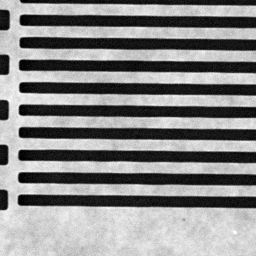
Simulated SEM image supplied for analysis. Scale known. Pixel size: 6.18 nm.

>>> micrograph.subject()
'groups of lines, slits or small figures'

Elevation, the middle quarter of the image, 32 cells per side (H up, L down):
LLLLLLLLLLLLLLLLLLLLLLLLLLLLLLLL
LLLLLLLLLLLLLLLLLLLLLLLLLLLLLLLL
HHHHHHHHHHHHHHHHHHHHHHHHHHHHHHHH
HHHHHHHHHHHHHHHHHHHHHHHHHHHHHHHH
LLLLLLLLLLLLLHHHHHHHHHHHHHHHHHHH
LLLLLLLLLLLLLLLLLLLLLLLLLLLLLLLL
LLLLLLLLLLLLLLLLLLLLLLLLLLLLLLLL
LLLLLLLLLLLLLLLLLLLLLLLLLLLLLLLL
HHHHHHHHHHHHHHHHHHHHHHHHHHHHHHHH
HHHHHHHHHHHHHHHHHHHHHHHHHHHHHHHH
LLLLLLLLLLLLLLLLLLLLLLLLLLLLLLLL
LLLLLLLLLLLLLLLLLLLLLLLLLLLLLLLL
LLLLLLLLLLLLLLLLLLLLLLLLLLLLLLLL
HHHHHHHHHHHHHHHHHHHHHHHHHHHHHHHH
HHHHHHHHHHHHHHHHHHHHHHHHHHHHHHHH
HHHHHHHHHHHHHHHHHHHHHHHHHHHHHHHH
LLLLLLLLLLLLLLLLLLLLLLLLLLLLLLLL
LLLLLLLLLLLLLLLLLLLLLLLLLLLLLLLL
LLLLLLLLLLLLLLLLLLLLLLLLLLLLLLLL
HHHHHHHHHHHHHHHHHHHHHHHHHHHHHHHH
HHHHHHHHHHHHHHHHHHHHHHHHHHHHHHHH
LLLLLHHHHHHHHHHHHHHHHHHHHHHHHHHH
LLLLLLLLLLLLLLLLLLLLLLLLLLLLLLLL
LLLLLLLLLLLLLLLLLLLLLLLLLLLLLLLL
HHHHHHHHHLLLHHHHLLLLLLLLLLLLLLLL
HHHHHHHHHHHHHHHHHHHHHHHHHHHHHHHH
HHHHHHHHHHHHHHHHHHHHHHHHHHHHHHHH
LLLLLLLLLLLLLLLLLLLLLLLLLLLLLLLL
LLLLLLLLLLLLLLLLLLLLLLLLLLLLLLLL
LLLLLLLLLLLLLLLLLLLLLLLLLLLLLLLL
HHHHHHHHHHHHHHHHHHHHHHHHHHHHHHHH
HHHHHHHHHHHHHHHHHHHHHHHHHHHHHHHH